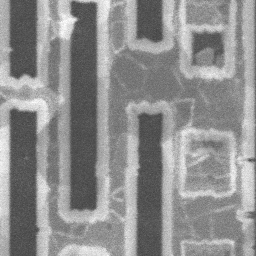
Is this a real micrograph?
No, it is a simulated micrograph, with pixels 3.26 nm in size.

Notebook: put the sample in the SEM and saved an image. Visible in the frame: one or a few lines or trenches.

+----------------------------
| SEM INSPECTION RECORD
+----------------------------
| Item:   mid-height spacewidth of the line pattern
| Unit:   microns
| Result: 0.122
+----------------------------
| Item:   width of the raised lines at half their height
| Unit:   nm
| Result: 73.7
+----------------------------